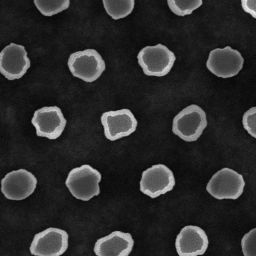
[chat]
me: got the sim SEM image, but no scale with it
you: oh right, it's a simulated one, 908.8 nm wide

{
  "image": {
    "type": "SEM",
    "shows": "a regular array of raised bodies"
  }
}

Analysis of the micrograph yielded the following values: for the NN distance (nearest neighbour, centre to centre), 67.5 pixels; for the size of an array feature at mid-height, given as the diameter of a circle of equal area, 114 nanometres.